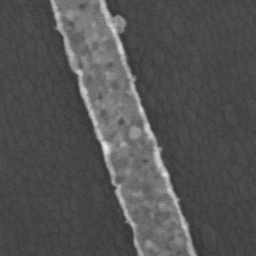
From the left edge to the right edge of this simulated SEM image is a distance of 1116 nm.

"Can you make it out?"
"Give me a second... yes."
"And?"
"one or a few lines or trenches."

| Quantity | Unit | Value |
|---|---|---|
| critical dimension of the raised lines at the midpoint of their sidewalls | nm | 220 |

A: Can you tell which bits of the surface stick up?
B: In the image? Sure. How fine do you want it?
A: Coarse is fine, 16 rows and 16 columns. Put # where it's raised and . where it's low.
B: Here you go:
...####.........
....###.........
....###.........
....####........
.....###........
.....###........
.....####.......
......###.......
......###.......
.......###......
.......###......
.......####.....
........###.....
........###.....
........####....
.........###....